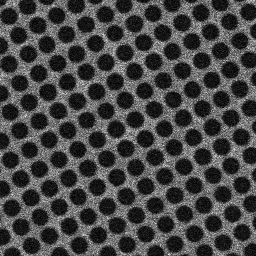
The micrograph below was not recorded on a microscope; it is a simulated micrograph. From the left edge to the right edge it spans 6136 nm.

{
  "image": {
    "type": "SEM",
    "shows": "a regular array of holes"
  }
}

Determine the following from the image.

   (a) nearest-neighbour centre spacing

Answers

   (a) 506 nanometres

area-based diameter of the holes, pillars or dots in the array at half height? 411 nanometres